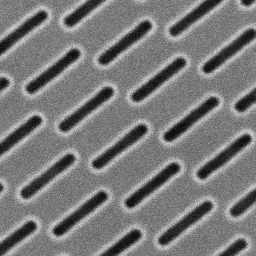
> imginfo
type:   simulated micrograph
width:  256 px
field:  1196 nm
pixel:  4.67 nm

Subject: a regular array of holes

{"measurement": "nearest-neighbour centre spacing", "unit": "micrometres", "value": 0.234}